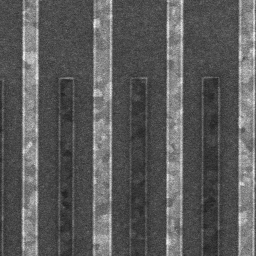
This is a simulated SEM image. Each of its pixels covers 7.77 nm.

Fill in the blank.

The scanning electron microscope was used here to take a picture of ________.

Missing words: parallel lines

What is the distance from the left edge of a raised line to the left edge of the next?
0.281 µm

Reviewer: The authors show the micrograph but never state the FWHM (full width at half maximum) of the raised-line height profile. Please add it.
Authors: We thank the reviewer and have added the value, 108 nm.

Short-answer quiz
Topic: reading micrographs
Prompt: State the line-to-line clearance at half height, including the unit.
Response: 165 nm